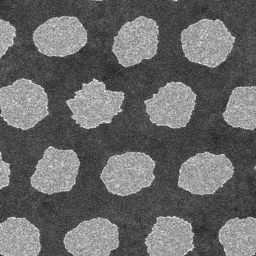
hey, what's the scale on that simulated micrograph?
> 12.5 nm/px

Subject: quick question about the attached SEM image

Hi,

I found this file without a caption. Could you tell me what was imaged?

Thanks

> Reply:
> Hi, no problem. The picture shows a regular array of raised bodies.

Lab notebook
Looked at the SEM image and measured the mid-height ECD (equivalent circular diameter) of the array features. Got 575 nanometers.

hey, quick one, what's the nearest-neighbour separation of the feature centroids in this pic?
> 905 nm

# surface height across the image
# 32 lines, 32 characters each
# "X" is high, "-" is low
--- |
--------------------------------
--------------------------------
------XXXX-------XX------X------
XX---XXXXX-----XXXXX---XXXXX----
XX--XXXXXXX----XXXXX---XXXXXX---
X---XXXXXXX---XXXXXX---XXXXXX---
-----XXXX-----XXXXX----XXXXXX---
---------------XXX------XXXX----
--------------------------------
--------------------------------
--XX-------XX--------XX---------
XXXXXX----XXXX------XXXX-----XXX
XXXXXX---XXXXXX----XXXXX-----XXX
XXXXXX---XXXXXX---XXXXXX----XXXX
XXXXXX---XXXXX-----XXXXX----XXXX
-XXX------XX--------XXX------XXX
--------------------------------
--------------------------------
------X-------------------------
-----XXXXX-----XXX------XXXX----
X----XXXXX---XXXXXX----XXXXXX---
X---XXXXXX---XXXXXX----XXXXXX---
X---XXXXX----XXXXXX---XXXXXX----
----XXXXX----XXXXX-----XXXX-----
--------------------------------
--------------------------------
--------------------------------
-XX--------XX-------XXX------XXX
XXXX-----XXXXXX----XXXXX----XXXX
XXXXX---XXXXXXX----XXXXX---XXXXX
XXXXX---XXXXXXX---XXXXXX----XXXX
XXXXX----XXXXX-----XXXX-----XXXX